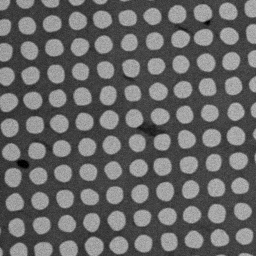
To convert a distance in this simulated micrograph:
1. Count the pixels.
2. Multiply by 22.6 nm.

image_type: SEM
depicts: an array of small figures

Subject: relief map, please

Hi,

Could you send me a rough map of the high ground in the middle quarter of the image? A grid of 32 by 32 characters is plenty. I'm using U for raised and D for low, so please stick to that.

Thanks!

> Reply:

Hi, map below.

DDDUUUDDUUUUDDDUUUUDDUUUUDDUUUUD
DDUUUUDDUUUUDDDUUUUDDUUUUDDDUUUD
DDUUUUDDDUUUDDDUUUDDDDDDDDDDDDDD
DDDUUUDDDDUDDDDDDDDDDDDDDDDDDDDD
DDDDDDDDDDDDDDDDDDDDDDDDDDDDDUUD
DDDDDDDDDDDDDDDDDUDDDDUUUDDDUUUU
DDDUUUDDDDUUUDDUUUUDDUUUUUDDUUUU
DDDUUUUDDUUUUDDUUUUDDUUUUUDDUUUU
DDDUUUUDDUUUUDDDUUUDDDUUUDDDDDDD
DDDUUUUDDUUUDDDDDDDDDDDDDDDDDDDD
DDDDDDDDDDDDDDDDDDDDDDDDDDDDDDDD
DDDDDDDDDDDDDDDDDUDDDDDUUDDDDUUU
DDDDUUDDDDUUUDDDUUUDDDUUUUDDUUUU
DDDUUUUDDUUUUUDDUUUUDDUUUUDDUUUU
UDDUUUUDDUUUUDDDUUUUDDUUUUDDDUUD
UDDUUUUDDDUUUDDDUUUDDDDDDDDDDDDD
DDDDDUDDDDDDDDDDDDDDDDDDDDDDDDDD
DDDDDDDDDDDDDDDDDDDDDDDDDDDDDUUU
DDDDDDDDDDDUUDDDDUUUDDDUUUDDDUUU
UDDDUUUDDDUUUUDDUUUUDDDUUUUDDUUU
UDDDUUUUDDUUUUDDUUUUDDDUUUDDDUUU
UUDDUUUUDDUUUUDDDUUUDDDDUDDDDDDD
UDDDUUUDDDDDDDDDDDDDDDDDDDDDDDDD
DDDDDDDDDDDDDDDDDDDDDDDDDDDDDDUU
DDDDDDDDDDDDUDDDDUUUDDDUUUDDDUUU
UDDDDUUDDDUUUUDDDUUUUDDUUUUDDUUU
UUDDUUUUDDUUUUDDDUUUUDDUUUUDDUUU
UUDDUUUUDDDUUUDDDUUUDDDUUUDDDDDD
UUDDDUUUDDDUUDDDDDDDDDDDDDDDDDDD
DDDDDDDDDDDDDDDDDDDDDDDDDDDDDDDU
DDDDDDDDDDDDDDDDDDUUDDDDUUUDDDUU
DDDDDUUDDDDUUUUDDUUUUDDUUUUDDDUU